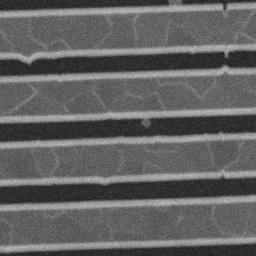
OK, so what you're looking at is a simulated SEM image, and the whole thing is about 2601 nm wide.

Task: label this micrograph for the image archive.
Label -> one or a few lines or trenches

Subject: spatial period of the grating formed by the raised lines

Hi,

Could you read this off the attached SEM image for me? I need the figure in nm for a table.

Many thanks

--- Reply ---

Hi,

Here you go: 653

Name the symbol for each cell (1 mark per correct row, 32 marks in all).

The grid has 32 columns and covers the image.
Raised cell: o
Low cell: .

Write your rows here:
................................
.......ooooooooooooooooooooooooo
oooooooooooooooooooooooooooooooo
oooooooooooooooooooooooooooooooo
oooooooooooooooooooooooooooooooo
oooooooooooooooooooooooooooooooo
oooooooooooooooooo..............
...o............................
................................
...........ooooooooooooooooooooo
oooooooooooooooooooooooooooooooo
oooooooooooooooooooooooooooooooo
oooooooooooooooooooooooooooooooo
oooooooooooooooooooooooooooooooo
oooooooooooooooo................
................................
................................
...............oo.oooooooooooooo
oooooooooooooooooooooooooooooooo
oooooooooooooooooooooooooooooooo
oooooooooooooooooooooooooooooooo
oooooooooooooooooooooooooooooooo
oooooooooooooo..................
................................
................................
.............ooooooooooooooooooo
oooooooooooooooooooooooooooooooo
oooooooooooooooooooooooooooooooo
oooooooooooooooooooooooooooooooo
oooooooooooooooooooooooooooooooo
ooooooooooooooooooooo...........
................................